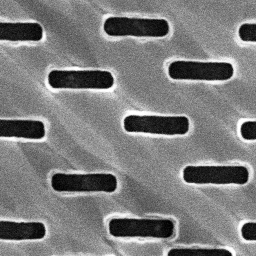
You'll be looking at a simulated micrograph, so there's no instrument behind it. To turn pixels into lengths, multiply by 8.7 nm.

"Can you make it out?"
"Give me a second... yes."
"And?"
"holes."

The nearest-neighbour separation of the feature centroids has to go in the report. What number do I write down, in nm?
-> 631